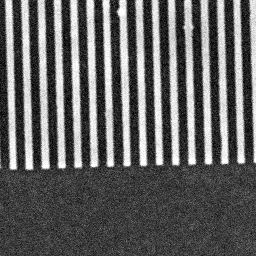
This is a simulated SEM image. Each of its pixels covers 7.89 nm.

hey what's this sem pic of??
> parallel lines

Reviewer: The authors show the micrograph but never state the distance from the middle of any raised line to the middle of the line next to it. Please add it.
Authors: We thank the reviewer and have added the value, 0.129 micrometres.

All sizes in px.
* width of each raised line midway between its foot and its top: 6.38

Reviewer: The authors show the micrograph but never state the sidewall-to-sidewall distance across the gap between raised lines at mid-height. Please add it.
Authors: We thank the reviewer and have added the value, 78.9 nm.